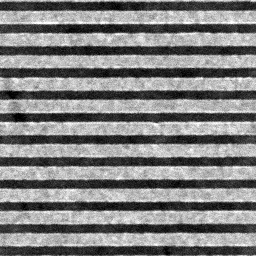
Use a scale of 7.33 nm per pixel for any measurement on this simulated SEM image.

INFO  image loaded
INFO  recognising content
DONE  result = parallel lines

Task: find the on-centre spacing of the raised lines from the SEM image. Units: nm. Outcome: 163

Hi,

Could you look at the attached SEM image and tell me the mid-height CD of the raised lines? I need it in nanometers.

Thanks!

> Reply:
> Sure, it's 86.2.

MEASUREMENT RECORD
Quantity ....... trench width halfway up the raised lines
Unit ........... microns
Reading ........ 0.0742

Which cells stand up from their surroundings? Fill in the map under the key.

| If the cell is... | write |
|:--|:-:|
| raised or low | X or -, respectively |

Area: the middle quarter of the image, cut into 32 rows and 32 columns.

XXXXXXXXXXXXXXXXXXXXXXXXXXXXXXXX
--------------------------------
--------------------------------
--------------------------------
XXXXXXXXXXXXXXXXXXXXXXXXXXXXXXXX
XXXXXXXXXXXXXXXXXXXXXXXXXXXXXXXX
--------------------------------
--------------------------------
--------------------------------
XXXXXXXXXXXXXXXXXXXXXXXXXXXXXXXX
XXXXXXXXXXXXXXXXXXXXXXXXXXXXXXXX
XXXXXXXXXXXXXXXXXXXXXXXXXXXXXXXX
--------------------------------
--------------------------------
--------------------------------
XXXXXXXXXXXXXXXXXXXXXXXXXXXXXXXX
XXXXXXXXXXXXXXXXXXXXXXXXXXXXXXXX
XXXXXXXXXXXXXXXXXXXXXXXXXXXXXXXX
--------------------------------
--------------------------------
XXXXXXXXXXXXXXXXXXXXXXXXXXXXXXXX
XXXXXXXXXXXXXXXXXXXXXXXXXXXXXXXX
XXXXXXXXXXXXXXXXXXXXXXXXXXXXXXXX
--------------------------------
--------------------------------
--------------------------------
XXXXXXXXXXXXXXXXXXXXXXXXXXXXXXXX
XXXXXXXXXXXXXXXXXXXXXXXXXXXXXXXX
XXXXXXXXXXXXXXXXXXXXXXXXXXXXXXXX
--------------------------------
--------------------------------
XXXXXXXXXXXXXXXXXXXXXXXXXXXXXXXX